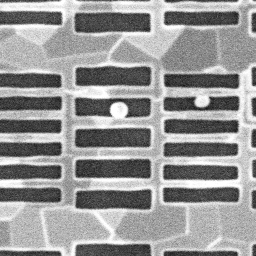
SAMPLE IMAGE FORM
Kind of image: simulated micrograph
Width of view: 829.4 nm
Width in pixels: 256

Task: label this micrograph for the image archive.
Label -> groups of lines, slits or small figures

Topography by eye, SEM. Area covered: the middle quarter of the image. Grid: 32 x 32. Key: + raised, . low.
+++++++++............+++++++++++
+++...................++++++++++
+++...................+++.......
+++...................+++.......
+++...................+++.......
+++..................++++.......
++++++++++++++++++++++++++++++++
++++++++++++++++++++++++++++++++
+++..................++++.......
++....................+++.......
++..........+++.......+++.......
+++.........++++......+++.......
+++.........+++.......++++++++++
++++++++++..+++.....++++++++++++
+++++++++++++++++++++++++.......
+++++++++++++++++++++++++.......
+++...................+++.......
+++...................++++......
++....................++++++++++
++....................++++......
+++...................+++.......
+++++++++++++++++++++++++.......
+++++++++++++++++++++++++.......
+++..................+++++++++++
++....................++++++++++
++....................+++.......
++....................++........
++....................++........
+++...................++........
+++++++++++++++++++++++++.......
+++++++++++++++++++++++++.......
+++...................++........